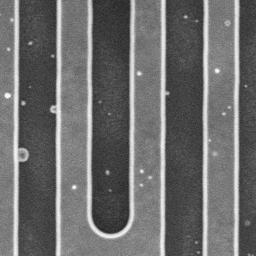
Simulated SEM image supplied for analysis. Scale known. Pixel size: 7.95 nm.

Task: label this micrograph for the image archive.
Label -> groups of lines, slits or small figures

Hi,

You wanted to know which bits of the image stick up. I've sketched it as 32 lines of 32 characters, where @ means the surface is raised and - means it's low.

@@-----@@@@-----@@@@------@@@@--
@@-----@@@@------@@@------@@@@--
@@-----@@@@-----@@@@------@@@@--
@@-----@@@@-----@@@@------@@@@--
@@-----@@@@-----@@@@------@@@@--
@@-----@@@@-----@@@@------@@@@--
@@-----@@@@-----@@@@------@@@@--
@@-----@@@@-----@@@@------@@@@--
@@-----@@@@-----@@@@------@@@@--
@@-----@@@@-----@@@@------@@@@--
@@-----@@@@-----@@@@------@@@@--
@@-----@@@@-----@@@@------@@@@--
@@-----@@@@-----@@@@------@@@@--
@@-----@@@@-----@@@@------@@@@--
@@-----@@@@-----@@@@------@@@@--
@@-----@@@@-----@@@@------@@@@--
@@-----@@@@-----@@@@------@@@@--
@@-----@@@@-----@@@@------@@@@--
@@-----@@@@-----@@@@------@@@@--
@@-----@@@@-----@@@@------@@@@--
@@-----@@@@-----@@@@------@@@@--
@@-----@@@@-----@@@@------@@@@--
@@-----@@@@-----@@@@------@@@@--
@@-----@@@@-----@@@@------@@@@--
@@-----@@@@-----@@@@------@@@@--
@@-----@@@@-----@@@@------@@@@--
@@-----@@@@-----@@@@------@@@@--
@@-----@@@@-----@@@@------@@@@--
@@-----@@@@@----@@@@------@@@@--
@@-----@@@@@@@@@@@@@------@@@@--
@@-----@@@@@@@@@@@@@------@@@---
@@-----@@@@@@@@@@@@@------@@@---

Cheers